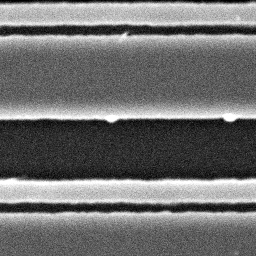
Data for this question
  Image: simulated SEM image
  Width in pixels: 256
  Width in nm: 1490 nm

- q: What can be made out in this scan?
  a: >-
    lines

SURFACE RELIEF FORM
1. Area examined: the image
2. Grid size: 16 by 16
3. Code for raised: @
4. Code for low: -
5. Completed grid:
@@@@@@@@@@@@@@@@
@@@@@@@@@@@@@@@@
@@@@@@@@@@@@@@@@
@@@@@@@@@@@@@@@@
@@@@@@@@@@@@@@@@
@@@@@@@@@@@@@@@@
@@@@@@@@@@@@@@@@
----------------
----------------
----------------
----------------
@@@@@@@@@@@@@@@@
@@@@@@@@@@@@@@@@
@@@@@@@@@@@@@@@@
@@@@@@@@@@@@@@@@
@@@@@@@@@@@@@@@@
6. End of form